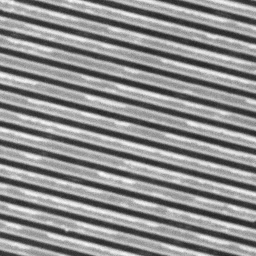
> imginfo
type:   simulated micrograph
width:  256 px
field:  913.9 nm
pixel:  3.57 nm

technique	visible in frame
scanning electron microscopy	parallel lines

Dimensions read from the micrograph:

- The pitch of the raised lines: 64.1 nanometers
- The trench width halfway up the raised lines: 31.6 nm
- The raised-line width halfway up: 31.6 nanometres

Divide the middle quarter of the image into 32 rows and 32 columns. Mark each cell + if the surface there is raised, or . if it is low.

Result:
.....+++++++++.........++++++++.
.........++++++++..........+++++
+++.........+++++++++.........++
+++++++.........+++++++++.......
..+++++++++.........+++++++++...
......++++++++..........++++++++
+.........+++++++++.........++++
+++++.........++++++++..........
++++++++..........++++++++......
....++++++++.........++++++++++.
........++++++++.........+++++++
++..........++++++++.........+++
++++++.........+++++++++........
..++++++++.........+++++++++....
......++++++++.........+++++++++
.........+++++++++.........+++++
++++.........+++++++++.........+
+++++++..........+++++++++......
...++++++++..........+++++++++..
......++++++++++.........+++++++
+.........++++++++++.........+++
+++++.........++++++++++........
+++++++++.........++++++++++....
....+++++++++.........+++++++++.
........+++++++++.........++++++
+++.........+++++++++.........++
+++++++.........+++++++++.......
..+++++++++.........+++++++++...
.....++++++++++.........++++++++
.........++++++++++.........++++
++++..........+++++++++.........
++++++++.........+++++++++......